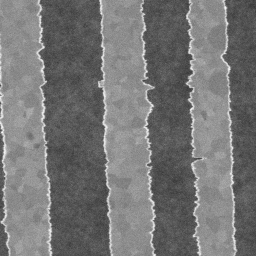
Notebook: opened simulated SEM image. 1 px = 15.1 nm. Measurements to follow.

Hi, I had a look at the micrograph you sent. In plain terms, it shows one or a few lines or trenches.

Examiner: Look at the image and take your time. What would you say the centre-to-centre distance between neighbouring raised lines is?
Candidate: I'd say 1370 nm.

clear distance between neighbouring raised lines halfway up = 794 nm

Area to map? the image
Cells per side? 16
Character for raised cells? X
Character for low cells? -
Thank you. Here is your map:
XX----XXX---XX--
XXX---XXX---XX--
XXX---XXX---XX--
XXX---XXX---XX--
XXX---XXX---XX--
XXX---XXX---XX--
XXX----XX---XX--
XXX----XX---XX--
XXX----XX---XX--
XXX----XX---XX--
XXX----XX---XX--
XXX----XX---XX--
XXX----XX---XXX-
XXX----XXX--XXX-
XXX----XXX--XXX-
-XX----XXX--XXX-